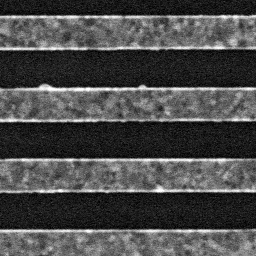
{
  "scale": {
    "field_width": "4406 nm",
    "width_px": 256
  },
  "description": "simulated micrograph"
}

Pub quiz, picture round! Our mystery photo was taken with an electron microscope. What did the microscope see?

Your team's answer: lines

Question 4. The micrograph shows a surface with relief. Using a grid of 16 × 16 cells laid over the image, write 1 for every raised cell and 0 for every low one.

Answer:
0000000000000000
1111111111111111
1111111111111111
0000000000000000
0000000000000000
0000000000000000
1111111111111111
1111111111111111
0000000000000000
0000000000000000
1111111111111111
1111111111111111
0000000000000000
0000000000000000
1111111111111111
1111111111111111